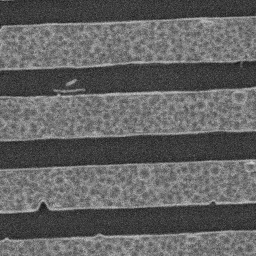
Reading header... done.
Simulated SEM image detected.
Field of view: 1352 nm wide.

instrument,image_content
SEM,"one or a few lines or trenches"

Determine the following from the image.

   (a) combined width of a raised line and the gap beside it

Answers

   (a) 376 nm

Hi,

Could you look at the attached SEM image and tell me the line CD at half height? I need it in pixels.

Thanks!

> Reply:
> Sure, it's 42.1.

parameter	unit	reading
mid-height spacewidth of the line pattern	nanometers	151